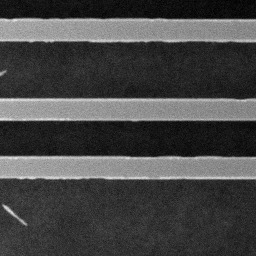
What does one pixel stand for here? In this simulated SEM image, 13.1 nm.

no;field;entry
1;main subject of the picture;lines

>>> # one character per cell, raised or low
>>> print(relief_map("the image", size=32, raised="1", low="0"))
00000000000000000000000000000000
00000000000000000000000000000000
11111111111111111111111111111111
11111111111111111111111111111111
11111111111111111111111111111111
00000000000000000000000000000000
00000000000000000000000000000000
00000000000000000000000000000000
00000000000000000000000000000000
00000000000000000000000000000000
00000000000000000000000000000000
00000000000000000000000000000000
11111111111111111111111001000000
11111111111111111111111111111111
11111111111111111111111111111111
00000000000000000000000000000000
00000000000000000000000000000000
00000000000000000000000000000000
00000000000000000000000000000000
00000000000000000000000000000000
11111111111111111111111111111111
11111111111111111111111111111111
00000000000000000000000000000000
00000000000000000000000000000000
00000000000000000000000000000000
00000000000000000000000000000000
00000000000000000000000000000000
00000000000000000000000000000000
00000000000000000000000000000000
00000000000000000000000000000000
00000000000000000000000000000000
00000000000000000000000000000000